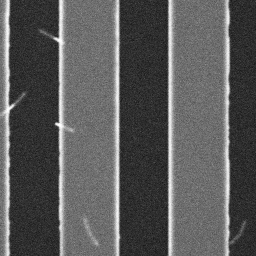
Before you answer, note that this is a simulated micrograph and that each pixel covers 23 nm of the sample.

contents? lines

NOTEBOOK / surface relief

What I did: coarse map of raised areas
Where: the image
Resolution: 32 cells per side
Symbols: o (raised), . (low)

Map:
o......oooooooo......ooooooo....
o......oooooooo......oooooooo...
o......oooooooo......oooooooo...
o......oooooooo......oooooooo...
o......oooooooo......oooooooo...
o......oooooooo......oooooooo...
o......oooooooo......oooooooo...
o......oooooooo......oooooooo...
o......oooooooo......oooooooo...
o......oooooooo......oooooooo...
o......oooooooo......oooooooo...
o......oooooooo......oooooooo...
o......oooooooo......oooooooo...
o......oooooooo......ooooooo....
o......oooooooo......ooooooo....
o......oooooooo......oooooooo...
o......oooooooo......ooooooo....
o......oooooooo......oooooooo...
o......oooooooo......ooooooo....
o......oooooooo......ooooooo....
o......oooooooo......oooooooo...
o......oooooooo......oooooooo...
o......oooooooo......oooooooo...
o......oooooooo......oooooooo...
o......oooooooo......oooooooo...
o......oooooooo......ooooooo....
o......oooooooo......ooooooo....
o......oooooooo......oooooooo...
o......oooooooo......oooooooo...
o.......ooooooo......oooooooo...
o.......ooooooo......ooooooo....
o.......ooooooo......oooooooo...